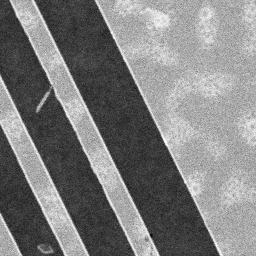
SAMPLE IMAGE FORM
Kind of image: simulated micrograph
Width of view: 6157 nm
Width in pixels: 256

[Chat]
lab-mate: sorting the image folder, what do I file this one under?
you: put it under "one or a few lines or trenches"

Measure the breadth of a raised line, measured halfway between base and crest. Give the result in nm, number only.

464